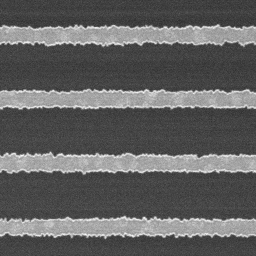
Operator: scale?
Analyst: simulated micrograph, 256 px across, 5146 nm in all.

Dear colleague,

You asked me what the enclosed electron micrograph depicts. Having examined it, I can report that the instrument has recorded one or a few lines or trenches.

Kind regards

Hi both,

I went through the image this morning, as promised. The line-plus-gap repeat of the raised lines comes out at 1.29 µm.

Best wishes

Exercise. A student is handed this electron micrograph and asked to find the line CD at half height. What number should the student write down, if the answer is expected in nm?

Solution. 309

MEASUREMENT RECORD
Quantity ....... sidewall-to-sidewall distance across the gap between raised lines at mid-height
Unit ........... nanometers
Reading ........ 977